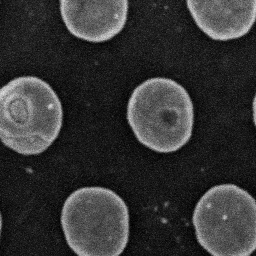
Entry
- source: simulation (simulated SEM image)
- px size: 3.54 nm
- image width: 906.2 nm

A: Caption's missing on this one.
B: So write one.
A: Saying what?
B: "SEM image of raised bodies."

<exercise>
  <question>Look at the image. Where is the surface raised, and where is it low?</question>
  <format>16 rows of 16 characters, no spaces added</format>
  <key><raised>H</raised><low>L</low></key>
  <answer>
LLLLHHHHLLLLHHHH
LLLLHHHHLLLLHHHH
LLLLLLLLLLLLLLLL
LLLLLLLLLLLLLLLL
LLLLLLLLLLLLLLLL
HHHLLLLLLHHLLLLL
HHHHLLLLHHHHLLLL
HHHHLLLLHHHHLLLL
HHHLLLLLLHHHLLLL
LHLLLLLLLLLLLLLL
LLLLLLLLLLLLLLLL
LLLLLLLLLLLLLLLL
LLLLHHHLLLLLLHHH
LLLLHHHHLLLLHHHH
LLLLHHHHLLLLHHHH
LLLLLHHHLLLLLHHH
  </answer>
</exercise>